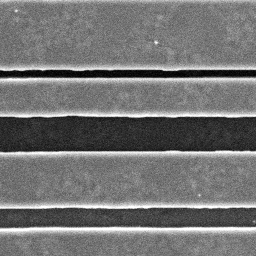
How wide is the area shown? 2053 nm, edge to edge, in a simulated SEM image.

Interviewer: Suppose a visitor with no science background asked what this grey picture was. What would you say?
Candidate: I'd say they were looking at lines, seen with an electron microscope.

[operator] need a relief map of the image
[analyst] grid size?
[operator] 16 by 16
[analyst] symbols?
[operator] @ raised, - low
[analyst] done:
@@@@@@@@@@@@@@@@
@@@@@@@@@@@@@@@@
@@@@@@@@@@@@@@@@
@@@@@@@@@@@@@@@@
@@@@@@@@@@@@@@@@
@@@@@@@@@@@@@@@@
@@@@@@@@@@@@@@@@
----------------
----------------
----------------
@@@@@@@@@@@@@@@@
@@@@@@@@@@@@@@@@
@@@@@@@@@@@@@@@@
@@@@@@@@@@@@@@@@
@@@@@@@@@@@@@@@@
@@@@@@@@@@@@@@@@